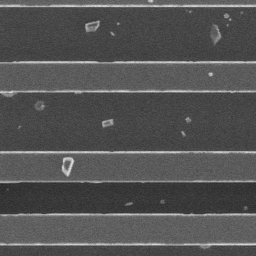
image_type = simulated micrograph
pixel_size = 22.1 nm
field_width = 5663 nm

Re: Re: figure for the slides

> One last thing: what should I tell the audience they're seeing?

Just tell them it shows lines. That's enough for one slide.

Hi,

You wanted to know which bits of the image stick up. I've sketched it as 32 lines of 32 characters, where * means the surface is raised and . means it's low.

********************************
................................
................................
................................
................................
................................
................................
................................
********************************
********************************
********************************
*...............................
................................
................................
................................
................................
................................
................................
................................
********************************
********************************
********************************
********************************
................................
................................
................................
................................
********************************
********************************
********************************
********************************
................................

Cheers